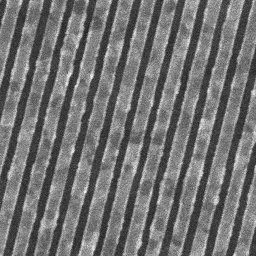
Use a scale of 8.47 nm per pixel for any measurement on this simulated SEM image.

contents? parallel lines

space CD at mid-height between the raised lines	67.8	nanometers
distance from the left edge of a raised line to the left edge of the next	183	nm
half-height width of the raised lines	113	nanometres